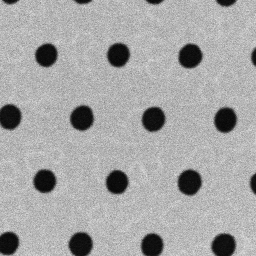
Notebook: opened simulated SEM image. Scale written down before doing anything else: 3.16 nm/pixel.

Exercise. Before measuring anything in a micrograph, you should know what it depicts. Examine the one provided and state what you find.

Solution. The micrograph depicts a regular array of holes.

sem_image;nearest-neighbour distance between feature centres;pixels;72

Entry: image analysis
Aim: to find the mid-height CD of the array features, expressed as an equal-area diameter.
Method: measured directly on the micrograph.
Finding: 73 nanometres